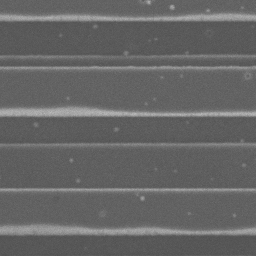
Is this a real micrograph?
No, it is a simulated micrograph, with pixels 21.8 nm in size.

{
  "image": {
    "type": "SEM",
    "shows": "lines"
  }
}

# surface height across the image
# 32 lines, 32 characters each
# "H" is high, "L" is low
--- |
HHHHHHHHHHHHHHHHHHHHHHHHHHHHHHHH
HHHHHHHHHHHHHHHHHHHHHHHHHHHHHHHH
LLLLLLLLLLLLLLLLLLLLLLLLLLLLLLLL
LLLLLLLLLLLLLLLLLLLLLLLLLLLLLLLL
LLLLLLLLLLLLLLLLLLLLLLLLLLLLLLLL
LLLLLLLLLLLLLLLLLLLLLLLLLLLLLLLL
LLLLLLLLLLLLLLLLLLLLLLLLLLLLLLLL
LLLLLLLLLLLLLLLLLLLLLLLLLLLLLLLL
HHHHHHHHHHHHHHHHHHHHHHHHHHHHHHHH
HHHHHHHHHHHHHHHHHHHHHHHHHHHHHHHH
HHHHHHHHHHHHHHHHHHHHHHHHHHHHHHHH
HHHHHHHHHHHHHHHHHHHHHHHHHHHHHHHH
HHHHHHHHHHHHHHHHHHHHHHHHHHHHHHHH
HHHHHHHHHHHHHHHHHHHHHHHHHHHHHHHH
LLLLLLLLLLLLLLLLLLLLLLLLLLLLLLLL
LLLLLLLLLLLLLLLLLLLLLLLLLLLLLLLL
LLLLLLLLLLLLLLLLLLLLLLLLLLLLLLLL
LLLLLLLLLLLLLLLLLLLLLLLLLLLLLLLL
LLLLLLLLLLLLLLLLLLLLLLLLLLLLLLLL
LLLLLLLLLLLLLLLLLLLLLLLLLLLLLLLL
LLLLLLLLLLLLLLLLLLLLLLLLLLLLLLLL
LLLLLLLLLLLLLLLLLLLLLLLLLLLLLLLL
LLLLLLLLLLLLLLLLLLLLLLLLLLLLLLLL
LLLLLLLLLLLLLLLLLLLLLLLLLLLLLLLL
HHHHHHHHHHHHHHHHHHHHHHHHHHHHHHHH
HHHHHHHHHHHHHHHHHHHHHHHHHHHHHHHH
HHHHHHHHHHHHHHHHHHHHHHHHHHHHHHHH
HHHHHHHHHHHHHHHHHHHHHHHHHHHHHHHH
HHHHHHHHHHHHHHHHHHHHHHHHHHHHHHHH
LLLLLLLLLLLLLLLLLLLLLLLLLLLLLLLL
LLLLLLLLLLLLLLLLLLLLLLLLLLLLLLLL
LLLLLLLLLLLLLLLLLLLLLLLLLLLLLLLL